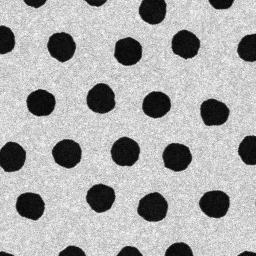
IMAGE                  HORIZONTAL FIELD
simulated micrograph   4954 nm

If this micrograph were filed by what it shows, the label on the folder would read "a regular array of holes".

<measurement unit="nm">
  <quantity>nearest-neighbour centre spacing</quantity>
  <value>1080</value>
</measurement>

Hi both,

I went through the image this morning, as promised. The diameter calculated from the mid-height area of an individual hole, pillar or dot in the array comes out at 563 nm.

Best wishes